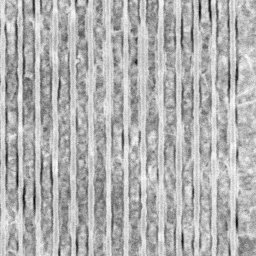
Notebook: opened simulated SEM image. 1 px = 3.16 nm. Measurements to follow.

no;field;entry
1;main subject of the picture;parallel lines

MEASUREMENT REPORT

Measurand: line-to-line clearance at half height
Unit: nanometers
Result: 39.8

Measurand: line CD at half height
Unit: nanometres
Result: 15.8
